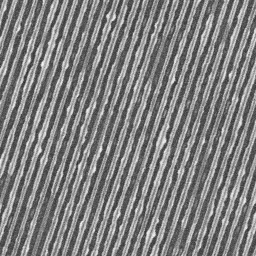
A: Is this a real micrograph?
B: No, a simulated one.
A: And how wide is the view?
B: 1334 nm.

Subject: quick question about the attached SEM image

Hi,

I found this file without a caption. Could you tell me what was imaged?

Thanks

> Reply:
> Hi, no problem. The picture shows parallel lines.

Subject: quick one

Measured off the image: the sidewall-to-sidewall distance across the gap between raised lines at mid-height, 24.8 nm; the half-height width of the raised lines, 4.76 pixels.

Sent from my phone